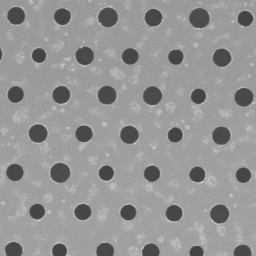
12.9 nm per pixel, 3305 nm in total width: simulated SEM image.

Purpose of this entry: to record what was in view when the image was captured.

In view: a regular array of holes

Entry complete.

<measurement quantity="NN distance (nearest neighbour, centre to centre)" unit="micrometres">0.58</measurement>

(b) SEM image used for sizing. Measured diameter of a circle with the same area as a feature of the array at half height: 214 nanometers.